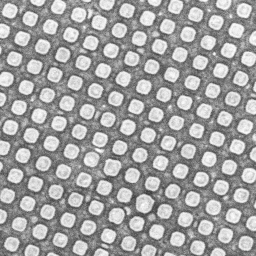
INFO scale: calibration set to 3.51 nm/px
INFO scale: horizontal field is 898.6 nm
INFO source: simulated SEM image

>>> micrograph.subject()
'a regular array of raised bodies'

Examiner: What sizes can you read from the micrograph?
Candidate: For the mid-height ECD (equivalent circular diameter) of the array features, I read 47.3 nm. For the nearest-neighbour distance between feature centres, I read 75.3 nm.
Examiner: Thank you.